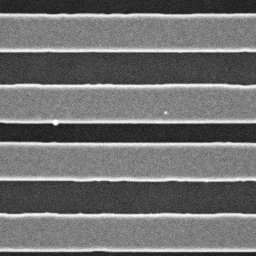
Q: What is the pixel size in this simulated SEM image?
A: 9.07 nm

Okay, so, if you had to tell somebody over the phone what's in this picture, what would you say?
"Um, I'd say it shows lines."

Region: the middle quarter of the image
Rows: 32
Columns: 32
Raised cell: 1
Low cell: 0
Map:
00000000000000000000000000000000
00000000000000000000000000000000
00000000000000000000000000000000
00000000000000000000000000000000
00000000000000000000000000000000
11111111111111111111111111111111
11111111111111111111111111111111
11111111111111111111111111111111
11111111111111111111111111111111
11111111111111111111111111111111
11111111111111111111111111111111
11111111111111111111111111111111
11111111111111111111111111111111
11111111111111111111111111111111
11111111111111111111111111111111
00000000000000000000000000000000
00000000000000000000000000000000
00000000000000000000000000000000
00000000000000000000000000000000
00000000000000000000000000000000
11111111111111111111111111111111
11111111111111111111111111111111
11111111111111111111111111111111
11111111111111111111111111111111
11111111111111111111111111111111
11111111111111111111111111111111
11111111111111111111111111111111
11111111111111111111111111111111
11111111111111111111111111111111
00000000000000000000000000000000
00000000000000000000000000000000
00000000000000000000000000000000